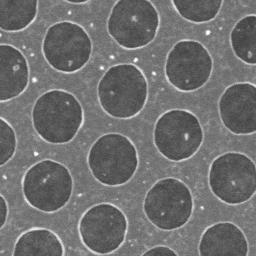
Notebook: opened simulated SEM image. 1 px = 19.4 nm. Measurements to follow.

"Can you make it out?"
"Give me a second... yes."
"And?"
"a regular array of holes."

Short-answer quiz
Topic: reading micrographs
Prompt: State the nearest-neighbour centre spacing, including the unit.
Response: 1350 nanometers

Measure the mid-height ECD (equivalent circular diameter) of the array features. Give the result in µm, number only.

0.959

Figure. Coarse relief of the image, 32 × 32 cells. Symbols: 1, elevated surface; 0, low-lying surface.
00000111111111000001110000001111
00001111111111000000110000011111
00001111111111000000111100111100
00011100001111000000111111111000
11111100000111000001111111111000
11111000000111100011110001111000
00111000000111111111100000111000
00011100000111111111100000111100
00011110001111000111100000111111
00001111111110000011100000111111
00011111111100000011100001111101
00011100111100000011111111110000
01111000001100000011111111100000
11110000001110000011111111100000
11110000001111000111000011110000
01110000001111111111000001110000
00111000001111111110000001111000
00111100011100001110000001111111
00111111111000000111000001111111
01111111111000000111100011110001
11111001111000000111111111100000
11100000011100000111111111000000
11100000011100001111001111000000
11100000011111111110000111000000
11100000011111111100000011100001
01110000111110111100000011111111
01111111111000011100000011111111
01111111110000001110000111111111
11111111110000001111001111000011
11100001110000001111111110000011
11000000111000011111111110000001
11000000111100111100001110000001